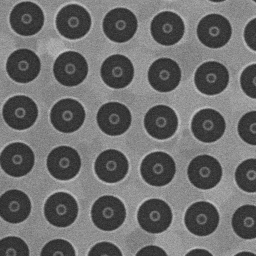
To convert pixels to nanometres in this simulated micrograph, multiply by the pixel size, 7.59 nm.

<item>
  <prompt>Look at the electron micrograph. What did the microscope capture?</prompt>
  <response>an array of small figures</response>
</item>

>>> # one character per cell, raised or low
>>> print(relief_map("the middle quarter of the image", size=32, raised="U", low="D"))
DUDDDDUUUDDDDDDDDUUUUDDDDDDDDUUU
UUUDDDUUUDDDUUDDDDUUUDDDDDDDDUUU
DDDDDDUUUDDDUUDDDDUUUDDDUUDDDUUU
DDDDDDUUUDDDDDDDDUUUUDDDUUDDDUUU
DDDDDUUUUUDDDDDDDUUUUDDDDDDDDUUU
DDDUUUUUUUUDDDDDUUUUUUDDDDDDUUUU
UUUUUUUUUUUUUUUUUUUUUUUDDDDUUUUU
UUUUUUUUUUUUUUUUUUUUUUUUUUUUUUUU
DDUUUUUUUUUUUUUUUUUUUUUUUUUUUUUU
DDDDUUUUUUUDDUUUUUUUUUUUUUUUUUUU
DDDDDUUUUDDDDDDUUUUUUUUDDDUUUUUU
DDDDDUUUDDDDDDDDUUUUUDDDDDDUUUUU
UUDDDUUUDDDDDDDDDUUUDDDDDDDDUUUU
UUDDDUUUDDDUUUDDDUUUDDDDUDDDDUUU
DDDDDUUUDDDDUDDDDUUUDDDUUDDDDUUU
DDDDUUUUDDDDDDDDDUUUDDDDUDDDDUUU
DDDUUUUUUDDDDDDDUUUUDDDDDDDDUUUU
UUUUUUUUUUDDDDDUUUUUUDDDDDDDUUUU
UUUUUUUUUUUUUUUUUUUUUUDDDDDUUUUU
UUUUUUUUUUUUUUUUUUUUUUUUUUUUUUUU
DUUUUUUUUUUUUUUUUUUUUUUUUUUUUUUU
DDDUUUUUUUDDDUUUUUUUUUUUUUUUUUUU
DDDDUUUUUDDDDDDUUUUUUDDDDDUUUUUU
DDDDUUUUDDDDDDDDUUUUDDDDDDDUUUUU
UDDDUUUUDDDUUDDDUUUDDDDDDDDDUUUD
UDDDUUUDDDDUUDDDUUUDDDDUDDDDUUUD
DDDDUUUDDDDDDDDDUUUDDDUUUDDDUUUD
DDDDUUUUDDDDDDDDUUUDDDDDDDDDUUUD
DDDUUUUUDDDDDDDUUUUDDDDDDDDUUUUD
UUUUUUUUUUDDDDUUUUUUDDDDDDDUUUUU
UUUUUUUUUUUUUUUUUUUUUUDDDUUUUUUU
UUUUUUUUUUUUUUUUUUUUUUUUUUUUUUUU